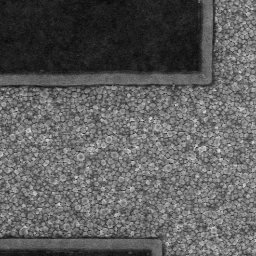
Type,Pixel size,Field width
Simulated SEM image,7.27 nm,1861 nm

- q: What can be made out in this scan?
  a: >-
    one or a few lines or trenches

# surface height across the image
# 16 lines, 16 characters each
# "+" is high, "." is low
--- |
+++++++++++++...
+++++++++++++...
+++++++++++++...
+++++++++++++...
+++++++++++++...
................
................
................
................
................
................
................
................
................
................
++++++++++......